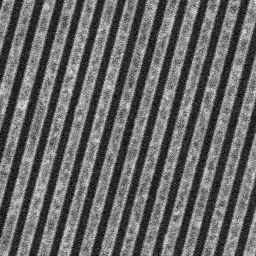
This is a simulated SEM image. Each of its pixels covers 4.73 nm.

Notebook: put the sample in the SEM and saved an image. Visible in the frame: parallel lines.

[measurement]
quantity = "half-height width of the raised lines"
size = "48 nm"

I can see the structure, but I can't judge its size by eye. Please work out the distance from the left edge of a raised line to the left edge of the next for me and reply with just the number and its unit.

94 nanometres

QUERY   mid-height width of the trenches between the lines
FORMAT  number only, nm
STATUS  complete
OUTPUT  44.1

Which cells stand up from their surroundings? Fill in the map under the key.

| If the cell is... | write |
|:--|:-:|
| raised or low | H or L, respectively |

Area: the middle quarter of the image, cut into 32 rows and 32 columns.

LHHHLLHHHLLHHHLLLHHLLLHHLLLHHLLL
LHHLLLHHLLLHHHLLHHHLLHHHLLLHHLLL
LHHLLLHHLLLHHLLLHHHLLHHHLLHHHLLH
HHHLLHHHLLLHHLLLHHLLLHHLLLHHHLLH
HHHLLHHHLLHHHLLLHHLLLHHLLLHHLLLH
HHLLLHHLLLHHHLLHHHLLHHHLLHHHLLLH
HHLLLHHLLLHHLLLHHHLLHHHLLHHHLLHH
HHLLHHHLLHHHLLLHHLLLHHLLLHHHLLHH
HHLLHHHLLHHHLLHHHLLHHHLLLHHLLLHH
HLLLHHLLLHHHLLHHHLLHHHLLHHHLLLHH
HLLHHHLLLHHLLLHHHLLHHHLLHHHLLHHH
HLLHHHLLHHHLLLHHLLLHHLLLHHHLLHHH
LLLHHLLLHHHLLHHHLLHHHLLLHHLLLHHL
LLLHHLLLHHLLLHHHLLHHHLLHHHLLHHHL
LLHHHLLLHHLLLHHLLLHHLLLHHHLLHHHL
LLHHHLLHHHLLLHHLLLHHLLLHHLLLHHLL
LLHHLLLHHHLLHHHLLHHHLLLHHLLLHHLL
LLHHLLLHHLLLHHHLLHHHLLHHHLLHHHLL
LHHHLLLHHLLLHHLLLHHLLLHHHLLHHHLL
LHHHLLHHHLLLHHLLLHHLLLHHLLLHHLLL
LHHLLLHHHLLHHHLLHHHLLLHHLLLHHLLL
HHHLLLHHLLLHHHLLHHHLLHHHLLHHHLLH
HHHLLHHHLLLHHLLLHHLLLHHHLLHHHLLH
HHHLLHHHLLHHHLLHHHLLLHHLLLHHLLLH
HHLLLHHHLLHHHLLHHHLLHHHLLHHHLLLH
HHLLLHHLLLHHLLLHHHLLHHHLLHHHLLHH
HHLLHHHLLLHHLLLHHLLLHHLLLHHHLLHH
HLLLHHHLLHHHLLHHHLLLHHLLLHHLLLHH
HLLLHHLLLHHHLLHHHLLHHHLLHHHLLLHH
HLLLHHLLLHHLLLHHLLLHHHLLHHHLLHHH
HLLHHHLLLHHLLLHHLLLHHLLLHHLLLHHH
LLLHHHLLHHHLLHHHLLLHHLLLHHLLLHHL